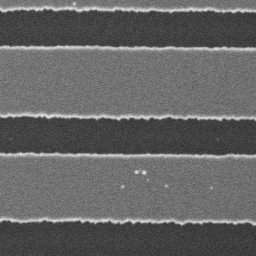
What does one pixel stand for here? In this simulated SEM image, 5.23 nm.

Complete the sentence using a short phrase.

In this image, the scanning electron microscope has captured lines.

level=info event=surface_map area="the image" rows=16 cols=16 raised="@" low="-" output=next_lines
@@@@@@@@@@@@@@@@
----------------
----------------
@@@@@@@@@@@@@@@@
@@@@@@@@@@@@@@@@
@@@@@@@@@@@@@@@@
@@@@@@@@@@@@@@@@
----------------
----------------
----------------
@@@@@@@@@@@@@@@@
@@@@@@@@@@@@@@@@
@@@@@@@@@@@@@@@@
@@@@@@@@@@@@@@@@
----------------
----------------